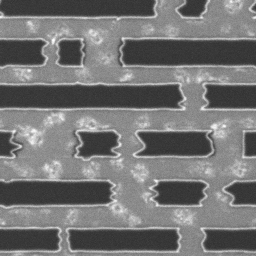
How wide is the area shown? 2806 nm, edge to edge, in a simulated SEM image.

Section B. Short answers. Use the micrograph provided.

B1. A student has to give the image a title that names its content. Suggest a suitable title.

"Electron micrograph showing parallel lines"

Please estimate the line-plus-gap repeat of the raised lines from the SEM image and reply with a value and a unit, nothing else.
0.515 micrometres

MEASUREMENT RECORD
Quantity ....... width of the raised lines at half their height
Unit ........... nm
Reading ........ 286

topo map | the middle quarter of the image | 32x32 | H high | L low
HHHHLLLLLLLLLLLHHHHHHHHHHHHHHHHH
LLLLLLLLLLLLLLLLLLLLLLLLLLLLLLLL
LLLLLLLLLLLLLLLLLLLLLLLLLLLLLLLL
LLLLLLLLLLLLLLLHLLLLLLLLLLLLLLLL
LLLLLLLLLLLLLLLLLLLLLLLLLLLLLLLL
HHHHHHHHHHHHHHHHHHHHHHHHHHHHHLLL
HHHHHHHHHHHHHHHHHHHHHHHHHHHHHLLL
HHHHHHHHHHHHHHHHHHHHHHHHHHHHHHLL
HHHHHHHHHHHHHHHHHHHHHHHHHHHHHHLL
HHHHHHHHHHHHHHHHHHHHHHHHHHHHHLLL
HHHHHHHHHHHHHHHHHHHHHHHHHHHHHLLL
LLLLLLLLLLLLLLLLLLLLLLLLLLLLLLLL
LLLLLLLLLLLLLLLLLLLLLLLLLLLLLLLL
LLLLLLLLLLLLLLLLLLLLLLLLLLLLLLLL
LLLLLLLLLLLLLLLLLLLLLLLLLLLLLLLL
LLLLLLLLLLLLLLLLLLLLLLLLLLLLLLLL
LLLLLLLLLLLHLLLLLLLLLLLLLLLHHLLL
LLLHHHHHHHHHHHLLLLHHHHHHHHHHHHHH
LLLLHHHHHHHHHHLLLLHHHHHHHHHHHHHH
LLLLHHHHHHHHHHLLLLLHHHHHHHHHHHHH
LLLLHHHHHHHHHHLLLLLLHHHHHHHHHHHH
LLLHHHHHHHHHLLLLLLLHHHHHHHHHHHHH
LLLHHHHHHHHHHHLLLLHHHHHHHHHHHHHH
LLLLHHHLLLLLLLLLLLLLLLLLLLLLLLLL
LLLLLLLLLLLLLLLLLLLLLLLLLLLLLLLL
LLLLLLLLLLLLLLLLLLLLLLLLLLLLLLLL
LLLLLLLLLLLLLLLLLLLLLLLLLLLLLLLL
LLLLLLLLLLLLLLLLLLLLLLLLLLLLLLLL
LLLLLLLLLLLLLLLLLLLLLLLLLLLLLLLL
HHHHHHHHHHHHLLLLLLLLLLLHHHHHHHHH
HHHHHHHHHHHHHLLLLLLLLLHHHHHHHHHH
HHHHHHHHHHHHLLLLLLLLLLHHHHHHHHHH